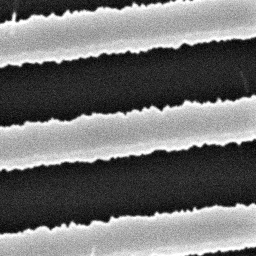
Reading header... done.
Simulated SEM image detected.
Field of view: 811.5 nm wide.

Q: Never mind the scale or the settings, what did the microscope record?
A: lines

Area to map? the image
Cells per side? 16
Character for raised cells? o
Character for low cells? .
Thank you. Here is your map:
........oooooooo
oooooooooooooooo
oooooooooooooo..
oooooo..........
................
................
............oooo
.....ooooooooooo
oooooooooooooooo
ooooooooo.......
o...............
................
................
.........ooooooo
..oooooooooooooo
ooooooooooooooo.